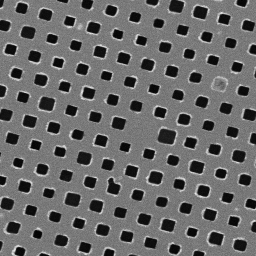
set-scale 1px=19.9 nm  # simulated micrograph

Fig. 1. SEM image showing a regular array of holes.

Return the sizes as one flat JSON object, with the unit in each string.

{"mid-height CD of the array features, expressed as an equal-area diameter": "0.232 µm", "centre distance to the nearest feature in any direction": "487 nm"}